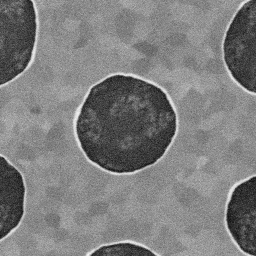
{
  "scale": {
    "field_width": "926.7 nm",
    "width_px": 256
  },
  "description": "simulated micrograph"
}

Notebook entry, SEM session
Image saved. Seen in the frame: holes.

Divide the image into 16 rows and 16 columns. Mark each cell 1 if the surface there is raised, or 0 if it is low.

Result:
0011111111111110
0011111111111100
0011111111111100
0011111111111100
0111111111111100
1111110000111110
1111100000011111
1111100000011111
1111100000011111
1111100000111111
0111110001111111
0111111111111110
0011111111111100
0111111111111100
0111111111111100
1111110001111110